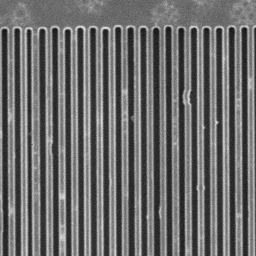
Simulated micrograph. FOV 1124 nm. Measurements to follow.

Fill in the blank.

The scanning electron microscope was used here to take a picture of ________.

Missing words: parallel lines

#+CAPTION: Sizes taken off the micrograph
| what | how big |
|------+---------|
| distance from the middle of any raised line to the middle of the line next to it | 55.4 nanometers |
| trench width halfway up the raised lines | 30.2 nanometres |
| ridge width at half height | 22.5 nm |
